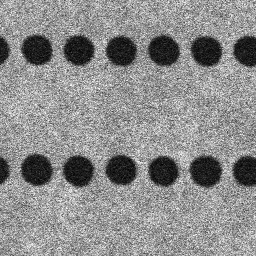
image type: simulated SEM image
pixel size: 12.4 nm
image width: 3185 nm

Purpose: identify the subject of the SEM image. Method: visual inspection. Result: a regular array of holes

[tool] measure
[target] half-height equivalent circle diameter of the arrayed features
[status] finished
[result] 384 nm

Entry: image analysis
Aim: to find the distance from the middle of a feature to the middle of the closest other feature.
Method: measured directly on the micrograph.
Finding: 524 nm